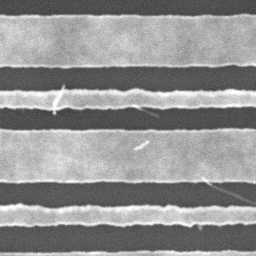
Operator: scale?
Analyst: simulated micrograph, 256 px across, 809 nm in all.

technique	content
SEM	lines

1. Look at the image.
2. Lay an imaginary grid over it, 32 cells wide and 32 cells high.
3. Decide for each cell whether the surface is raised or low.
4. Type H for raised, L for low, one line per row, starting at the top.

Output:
LLLLLLLLLLLLLLLLLLLLLLLLLLLLLLLL
LLLLLLLLLLLLLLLLLLLLLLLLLLLLLLLL
HHHHHHHHHHHHHHHHHHHHHHHHHHHHHHHH
HHHHHHHHHHHHHHHHHHHHHHHHHHHHHHHH
HHHHHHHHHHHHHHHHHHHHHHHHHHHHHHHH
HHHHHHHHHHHHHHHHHHHHHHHHHHHHHHHH
HHHHHHHHHHHHHHHHHHHHHHHHHHHHHHHH
HHHHHHHHHHHHHHHHHHHHHHHHHHHHHHHH
LLLLLLLLLLLLLLLLLLLLLLLLLLLLLLLL
LLLLLLLLLLLLLLLLLLLLLLLLLLLLLLLL
LLLLLLLLLLLLLLLLLLLLLLLLLLLLLLLL
HHHHHHHHHHHHHHHHHHHLLHHHHHHHHHHH
HHHHHHHHHHHHHHHHHHHHHHHHHHHHHHHH
LHHHHHHHHHHHHHHHLLLHHLHHHLLLLLLL
LLLLLLLLLLLLLLLLLLLLLLLLLLLLLLLL
LLLLLLLLLLLLLLLLLLLLLLLLLLLLLLLL
HHHHHHHHHHHHHHHHHHHHHHHHHHHHHHHH
HHHHHHHHHHHHHHHHHHHHHHHHHHHHHHHH
HHHHHHHHHHHHHHHHHHHHHHHHHHHHHHHH
HHHHHHHHHHHHHHHHHHHHHHHHHHHHHHHH
HHHHHHHHHHHHHHHHHHHHHHHHHHHHHHHH
HHHHHHHHHHHHHHHHHHHHHHHHHHHHHHHH
HHHHHHHHHHHHHHHHHHHHHHHHHHHHHHHH
LLLLLLLLLLLLLLLLLLLLLLLLLLLLLLLL
LLLLLLLLLLLLLLLLLLLLLLLLLLLLLLLL
LLLLLLLLLLLLLLLLLLLLLLLLLLLLLLLL
HHHHHHHHHHHHHHHHHHHHHHHHHHHHHHHH
HHHHHHHHHHHHHHHHHHHHHHHHHHHHHHHH
LLLLLLLLLLLLLLLLLLLLLLLLLLLLLLLL
LLLLLLLLLLLLLLLLLLLLLLLLLLLLLLLL
LLLLLLLLLLLLLLLLLLLLLLLLLLLLLLLL
LLLLLLLLLLLLLLLLLHHHHHLLHLLHHHLH